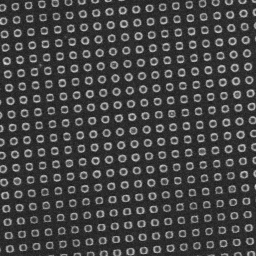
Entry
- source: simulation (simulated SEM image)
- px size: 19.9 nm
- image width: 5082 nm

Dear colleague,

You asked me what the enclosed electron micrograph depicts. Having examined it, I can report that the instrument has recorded a regular array of raised bodies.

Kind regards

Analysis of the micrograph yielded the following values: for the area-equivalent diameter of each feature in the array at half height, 7.14 px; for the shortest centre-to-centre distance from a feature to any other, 261 nm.